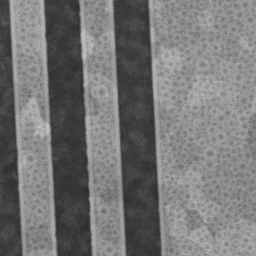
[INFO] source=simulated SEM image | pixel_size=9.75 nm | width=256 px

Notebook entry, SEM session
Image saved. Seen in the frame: one or a few lines or trenches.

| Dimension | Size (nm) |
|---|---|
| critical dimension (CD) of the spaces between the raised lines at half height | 386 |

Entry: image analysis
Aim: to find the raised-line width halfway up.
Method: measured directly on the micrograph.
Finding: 0.285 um